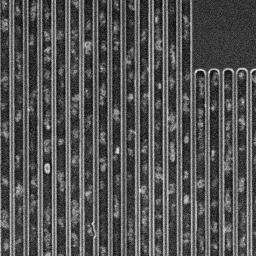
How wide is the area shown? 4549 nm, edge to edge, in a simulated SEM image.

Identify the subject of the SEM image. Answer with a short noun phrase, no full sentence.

parallel lines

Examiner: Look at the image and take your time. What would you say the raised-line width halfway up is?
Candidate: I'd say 77.7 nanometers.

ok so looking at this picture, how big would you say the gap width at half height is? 0.169 microns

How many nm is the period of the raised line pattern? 248